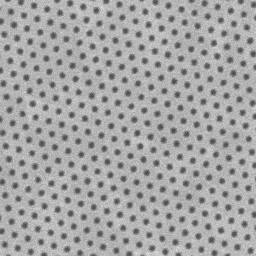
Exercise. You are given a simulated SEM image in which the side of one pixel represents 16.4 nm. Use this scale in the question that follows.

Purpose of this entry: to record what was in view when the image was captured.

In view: a regular array of holes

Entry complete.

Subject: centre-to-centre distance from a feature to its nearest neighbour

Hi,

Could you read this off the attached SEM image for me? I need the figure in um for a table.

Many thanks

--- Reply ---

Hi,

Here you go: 0.219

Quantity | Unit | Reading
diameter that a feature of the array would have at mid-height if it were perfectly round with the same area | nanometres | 117